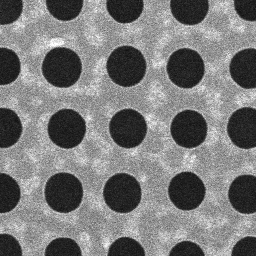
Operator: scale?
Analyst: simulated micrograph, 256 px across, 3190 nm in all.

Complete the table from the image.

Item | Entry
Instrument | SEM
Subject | a regular array of holes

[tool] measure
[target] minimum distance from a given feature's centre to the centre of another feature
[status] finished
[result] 758 nanometres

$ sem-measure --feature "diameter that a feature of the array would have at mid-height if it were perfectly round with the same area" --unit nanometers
493